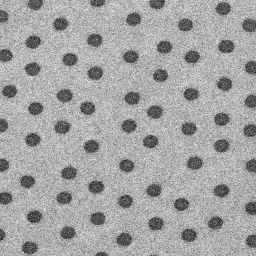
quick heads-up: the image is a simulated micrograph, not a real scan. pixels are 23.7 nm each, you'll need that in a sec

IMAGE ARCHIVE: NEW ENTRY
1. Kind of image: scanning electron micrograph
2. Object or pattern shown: a regular array of holes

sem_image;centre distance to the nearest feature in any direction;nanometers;736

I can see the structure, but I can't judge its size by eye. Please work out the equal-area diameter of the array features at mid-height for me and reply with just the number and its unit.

14.6 px